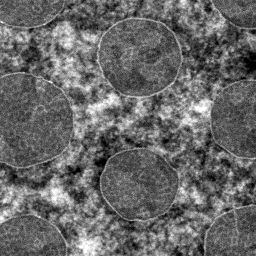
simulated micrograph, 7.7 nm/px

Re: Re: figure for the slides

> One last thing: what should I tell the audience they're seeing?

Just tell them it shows raised bodies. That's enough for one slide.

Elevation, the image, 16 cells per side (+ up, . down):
++++.........+++
+++....+++.....+
......+++++.....
......+++++.....
......+++++.....
++++...+++....++
++++.........+++
+++++........+++
++++.........+++
++++....++....++
.......++++.....
......+++++.....
.......++++.....
.+......++....++
++++.........+++
++++.........+++